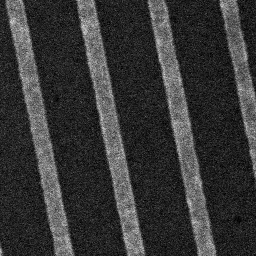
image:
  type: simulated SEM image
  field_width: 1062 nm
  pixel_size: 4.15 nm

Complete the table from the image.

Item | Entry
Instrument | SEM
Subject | one or a few lines or trenches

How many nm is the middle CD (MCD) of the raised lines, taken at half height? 66.7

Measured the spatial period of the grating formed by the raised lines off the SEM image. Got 0.29 um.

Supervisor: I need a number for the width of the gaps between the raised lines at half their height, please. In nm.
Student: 226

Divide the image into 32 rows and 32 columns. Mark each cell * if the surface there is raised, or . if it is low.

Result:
.**.......**.......**.......**..
.**.......**.......**.......**..
.**.......**.......**.......**..
.**.......**.......**.......**..
..**......***......**.......**..
..**.......**.......**.......*..
..**.......**.......**.......**.
..**.......**.......**.......**.
..**.......**.......**.......**.
...**......***......**.......**.
...**.......**.......**.......**
...**.......**.......**.......**
...**.......**.......**.......**
...**.......**.......**.......**
....**......***......**.......**
....**.......**.......**.......*
....**.......**.......**.......*
....**.......**.......**.......*
....**.......**.......**.......*
.....**......***......**.......*
.....**.......**.......**.......
.....**.......**.......**.......
.....**.......**.......**.......
.....**.......**.......**.......
......**......**.......**.......
......**.......**.......**......
......**.......**.......**......
......**.......**.......**......
......**.......**.......**......
.......**......**.......**......
.......**.......**.......**.....
.......**.......**.......**.....